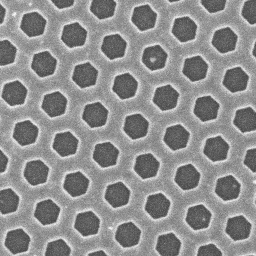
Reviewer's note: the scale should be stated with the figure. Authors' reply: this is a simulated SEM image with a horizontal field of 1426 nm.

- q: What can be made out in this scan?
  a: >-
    a regular array of holes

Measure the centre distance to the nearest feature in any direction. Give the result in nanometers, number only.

228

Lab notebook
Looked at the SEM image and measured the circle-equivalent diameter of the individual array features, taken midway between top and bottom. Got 146 nanometres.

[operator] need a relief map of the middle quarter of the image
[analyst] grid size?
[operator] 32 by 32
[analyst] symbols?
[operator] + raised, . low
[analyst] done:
+++....+++++++++++++.....+++++..
++......+++++++++++++...++++++..
++.......+++++...+++++++++++++..
++......++++......+++++++++++++.
++......++++.......+++++++++++++
+++....+++++.......+++++...+++++
++++++++++++......+++++.....++++
+++++++++++++.....++++.......+++
.+++++++++++++...+++++.......+++
.+++++++.+++++++++++++......++++
.++++.....+++++++++++++.....++++
.++++......+++++++++++++..++++++
+++++......++++++..+++++++++++++
++++.......++++.....++++++++++++
+++++......++++......+++++++++++
++++++....+++++......+++++....++
+++++++++++++++......++++......+
..+++++++++++++......++++.......
...+++++++++++++...++++++......+
....++++++..+++++++++++++......+
...+++++.....+++++++++++++.....+
...+++++......+++++++++++++..+++
...++++.......++++++..++++++++++
+++++++.......++++.....+++++++++
++++++++.....+++++......++++++++
+++++++++....++++.......+++++...
+++++++++++++++++.......++++....
.....+++++++++++++.....+++++....
......+++++++++++++....++++.....
.......++++++..+++++++++++++....
.......++++.....+++++++++++++...
......++++.......+++++++++++++.+